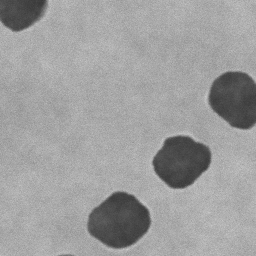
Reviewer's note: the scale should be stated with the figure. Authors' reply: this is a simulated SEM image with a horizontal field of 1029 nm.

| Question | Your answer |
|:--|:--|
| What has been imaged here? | holes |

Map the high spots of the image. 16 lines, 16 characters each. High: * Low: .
...*************
..**************
****************
****************
**************.*
*************...
*************...
**************..
****************
**********...***
**********...***
**********..****
*******..*******
******...*******
******...*******
****************